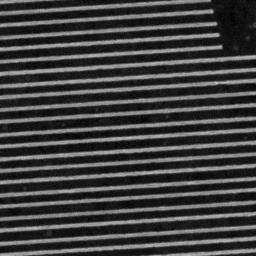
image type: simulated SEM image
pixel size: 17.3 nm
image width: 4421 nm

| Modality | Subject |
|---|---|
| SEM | parallel lines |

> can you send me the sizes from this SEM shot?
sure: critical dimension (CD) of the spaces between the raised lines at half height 162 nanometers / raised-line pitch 208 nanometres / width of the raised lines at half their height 43.1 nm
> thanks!